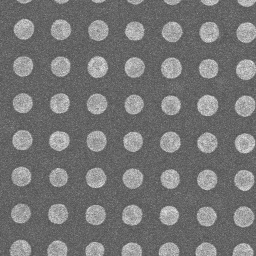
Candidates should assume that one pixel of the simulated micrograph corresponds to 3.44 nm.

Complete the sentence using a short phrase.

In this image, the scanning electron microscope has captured a regular array of raised bodies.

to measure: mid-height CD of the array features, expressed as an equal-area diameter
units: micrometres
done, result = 0.0679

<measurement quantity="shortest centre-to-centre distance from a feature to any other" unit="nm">126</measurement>